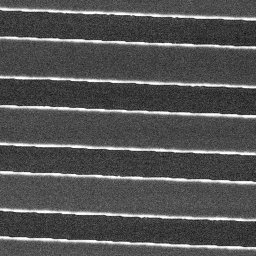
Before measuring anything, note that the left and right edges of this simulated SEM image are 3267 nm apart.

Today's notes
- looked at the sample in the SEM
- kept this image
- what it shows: lines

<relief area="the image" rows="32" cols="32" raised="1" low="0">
11111111111111111111111111111111
00000000111111111111111111111111
00000000000000000000000000000000
00000000000000000000000000000000
00000000000000000000000000000000
11111111111111111111110000000000
11111111111111111111111111111111
11111111111111111111111111111111
11111111111111111111111111111111
11111111111111111111111111111111
00000000000000000000001111111111
00000000000000000000000000000000
00000000000000000000000000000000
11111111100000000000000000000000
11111111111111111111111111111100
11111111111111111111111111111111
11111111111111111111111111111111
11111111111111111111111111111111
00000000000111111111111111111111
00000000000000000000000000000000
00000000000000000000000000000000
00000000000000000000000000000000
11111111111111111111111000000000
11111111111111111111111111111111
11111111111111111111111111111111
11111111111111111111111111111111
00001111111111111111111111111111
00000000000000000000000000000111
00000000000000000000000000000000
00000000000000000000000000000000
11111111111111111110000000000000
11111111111111111111111111111111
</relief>